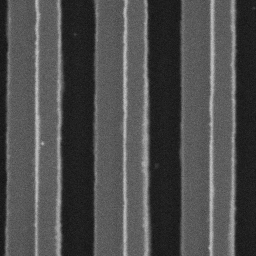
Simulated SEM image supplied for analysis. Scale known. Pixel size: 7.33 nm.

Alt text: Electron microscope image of lines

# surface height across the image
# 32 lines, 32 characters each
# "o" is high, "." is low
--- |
.oooooo.....oooooo.....oooooo...
.ooooooo....oooooo.....oooooo...
.ooooooo....oooooo.....oooooo...
.ooooooo....oooooo.....oooooo...
.ooooooo....oooooo.....oooooo...
.ooooooo....oooooo.....oooooo...
.ooooooo....oooooo.....oooooo...
.ooooooo....oooooo.....oooooo...
.ooooooo....oooooo.....oooooo...
.ooooooo....oooooo.....oooooo...
.ooooooo....oooooo.....oooooo...
.ooooooo....oooooo.....oooooo...
.ooooooo....oooooo.....oooooo...
.ooooooo....oooooo.....oooooo...
.ooooooo....oooooo.....oooooo...
.ooooooo....oooooo.....oooooo...
.ooooooo....oooooo.....oooooo...
.ooooooo....oooooo.....oooooo...
.oooooo.....oooooo.....oooooo...
.ooooooo....oooooo.....oooooo...
.ooooooo....oooooo.....oooooo...
.ooooooo....oooooo.....oooooo...
.ooooooo....oooooo.....oooooo...
.ooooooo....oooooo.....oooooo...
.ooooooo....oooooo.....oooooo...
.ooooooo....oooooo.....oooooo...
.oooooo.....oooooo.....oooooo...
.oooooo.....ooooooo....oooooo...
.ooooooo....oooooo.....oooooo...
.ooooooo....ooooooo....oooooo...
.ooooooo....ooooooo....oooooo...
.ooooooo....ooooooo....oooooo...